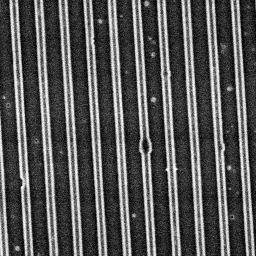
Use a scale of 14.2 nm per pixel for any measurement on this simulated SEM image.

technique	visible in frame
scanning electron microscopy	parallel lines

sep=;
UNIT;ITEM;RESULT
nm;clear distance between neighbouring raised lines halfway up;256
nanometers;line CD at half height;97.7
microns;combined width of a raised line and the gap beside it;0.35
